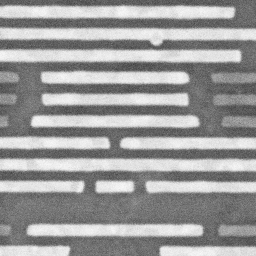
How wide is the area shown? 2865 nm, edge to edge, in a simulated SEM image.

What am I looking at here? wiring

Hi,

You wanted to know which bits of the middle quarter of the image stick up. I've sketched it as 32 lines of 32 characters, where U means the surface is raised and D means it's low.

DDDDDDDDDDDDDDDDDDDDDDDDDDDDDDDD
DDDDDDDDDDDDDDDDDDDDDDDDDDDDDDDD
UUUUUUUUUUUUUUUUUUUUUUUUUUUUUUUD
UUUUUUUUUUUUUUUUUUUUUUUUUUUUUUUD
UUUUUUUUUUUUUUUUUUUUUUUUUUUUUUUD
DDDDDDDDDDDDDDDDDDDDDDDDDDDDDDDD
DDDDDDDDDDDDDDDDDDDDDDDDDDDDDDDD
DDDDDDDDDDDDDDDDDDDDDDDDDDDDDDDD
UUUUUUUUUUUUUUUUUUUUUUUUUUUUUUUD
UUUUUUUUUUUUUUUUUUUUUUUUUUUUUUUD
DDDDDDDDDDDDDDDDDDDDDDDDDDDDDDDD
DDDDDDDDDDDDDDDDDDDDDDDDDDDDDDDD
DDDDDDDDDDDDDDDDDDDDDDDDDDDDDDDD
UUUUUUUUUUUUUUUUUUUUUUUUUUUUUUUU
UUUUUUUUUUUUUUUUUUUUUUUUUUUUUUUU
UUUUUUUUUUUUUUUUUUUUUUUUUUUUUUUU
DDDDDDDDDDDDDDDDDDDDDDDDDDDDDDDD
DDDDDDDDDDDDDDDDDDDDDDDDDDDDDDDD
DDDDDDDDDDDDDDDDDDDDDDDDDDDDDDDD
UUUUUUUUUUUDDDUUUUUUUUUUUUUUUUUU
UUUUUUUUUUUDDDUUUUUUUUUUUUUUUUUU
DDDDDDDDDDDDDDDDDDDDDDDDDDDDDDDD
DDDDDDDDDDDDDDDDDDDDDDDDDDDDDDDD
DDDDDDDDDDDDDDDDDDDDDDDDDDDDDDDD
UUUUUUUUUUUUUUUUUUUUUUUUUUUUUUUU
UUUUUUUUUUUUUUUUUUUUUUUUUUUUUUUU
UUUUUUUDDDDDDDDDUUUUDDDDUUUDDUUU
DDDDDDDDDDDDDDDDDDDDDDDDDDDDDDDD
DDDDDDDDDDDDDDDDDDDDDDDDDDDDDDDD
UUUUDDDDDUUUUUUUUDDDDUUUUUDDDDDD
UUUUUDDDUUUUUUUUUDDDDUUUUUUUUUUU
UUUUDDDDUUUUUUUUUDDDDUUUUUUUUUUU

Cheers